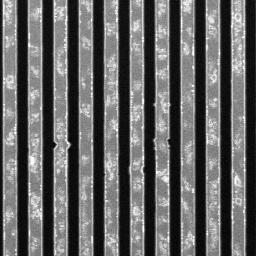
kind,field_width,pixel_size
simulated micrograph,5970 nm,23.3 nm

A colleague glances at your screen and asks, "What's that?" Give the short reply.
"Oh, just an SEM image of parallel lines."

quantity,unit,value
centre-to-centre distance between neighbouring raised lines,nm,592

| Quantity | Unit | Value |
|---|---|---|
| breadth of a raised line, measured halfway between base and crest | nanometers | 318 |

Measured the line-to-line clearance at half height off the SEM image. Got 271 nanometres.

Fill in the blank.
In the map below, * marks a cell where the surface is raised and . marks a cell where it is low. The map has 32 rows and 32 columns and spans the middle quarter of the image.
*...***...***....***...***...***
*...***...***....***...***...***
*...***...***....***...***...***
*...***...***....***...***...***
*...***...***....***...***...***
*...***...***....***...***...***
*...***...***....***...***...***
*...***...***....***...***...***
*...***...***....***...***...***
*...***...***....***...***...***
*...***...***....***...****..***
*...***...***....***...***...***
*...***...***....***...***...***
*...***...****...***...***...***
*...***...****...***...***...***
*...***...****...***...***...***
*...***...****...***...***...***
*...***...****...***...***...***
*...***...****...***...***...***
*...***...****...***..****...***
*...***...****...***...***...***
*...***...****...***...***...***
*...***...****...***...***...***
*...***...****...***...***...***
*...***...****...***...***...***
*...***...****..****...***...***
*...***...****..****...***...***
*...***...****..****...***...***
*...***...****...***...***...***
*...***...****...***...***...***
*...***...****...***...***...***
*...***...****...***...***...***